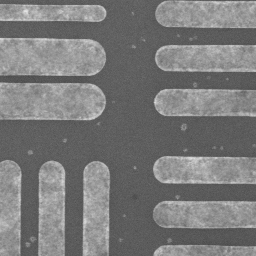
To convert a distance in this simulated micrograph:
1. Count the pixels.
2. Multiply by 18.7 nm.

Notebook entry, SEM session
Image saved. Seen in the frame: groups of lines, slits or small figures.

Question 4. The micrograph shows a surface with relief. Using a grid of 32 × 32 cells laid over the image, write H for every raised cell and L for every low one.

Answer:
LLLLLLLLLLLLLLLLLLLLHHHHHHHHHHHH
HHHHHHHHHHHHHLLLLLLHHHHHHHHHHHHH
LLLLLLHHHHHHHLLLLLLLHHHHHHHHHHHH
LLLLLLLLLLLLLLLLLLLLLLLLLLLLLLLL
LLLLLLLLLLLLLLLLLLLLLLLLLLLLLLLL
HHHHHHHHHHHHLLLLLLLLLLLLLLLLLLLL
HHHHHHHHHHHHHLLLLLLLHHHHHHHHHHHH
HHHHHHHHHHHHHLLLLLLHHHHHHHHHHHHH
HHHHHHHHHHHHHLLLLLLLHHHHHHHHHHHH
LLLLLLLLLLLLLLLLLLLLLLLLLLLLLLLL
HHHHHHHHHHHLLLLLLLLLLLLLLLLLLLLL
HHHHHHHHHHHHHLLLLLLLHHHHHHHHHHHH
HHHHHHHHHHHHHLLLLLLHHHHHHHHHHHHH
HHHHHHHHHHHHHLLLLLLHHHHHHHHHHHHH
HHHHHHHHHHHHLLLLLLLLLLLLLLLLLLLL
LLLLLLLLLLLLLLLLLLLLLLLLLLLLLLLL
LLLLLLLLLLLLLLLLLLLLLLLLLLLLLLLL
LLLLLLLLLLLLLLLLLLLLLLLLLLLLLLLL
LLLLLLLLLLLLLLLLLLLLLLLLLLLLLLLL
LLLLLLLLLLLLLLLLLLLLLLLLLLLLLLLL
HHLLLLHLLLLHHLLLLLLHHHHHHHHHHHHH
HHHLLHHHLLLHHHLLLLLHHHHHHHHHHHHH
HHLLLHHHLLLHHHLLLLLLHHHHHHHHHHHH
HHLLLHHHLLLHHHLLLLLLLLLLLLLLLLLL
HHLLLHHHLLLHHHLLLLLLLLLLLLLLLLLL
HHLLLHHHLLLHHHLLLLLLHHHHHHHHHHHH
HHLLLHHHLLLHHHLLLLLHHHHHHHHHHHHH
HHLLLHHHLLLHHHLLLLLHHHHHHHHHHHHH
HHLLLHHHLLLHHLLLLLLLLLLLLLLLLLLL
HHLLLHHHLLLHHLLLLLLLLLLLLLLLLLLL
HHLLLHHHLLLHHLLLLLLLLLLLLLLLLLLL
HHLLLHHHLLLHHLLLLLLLHHHHHHHHHHHH